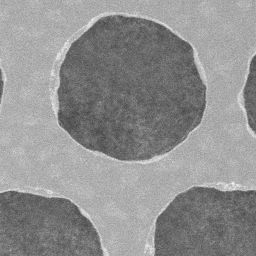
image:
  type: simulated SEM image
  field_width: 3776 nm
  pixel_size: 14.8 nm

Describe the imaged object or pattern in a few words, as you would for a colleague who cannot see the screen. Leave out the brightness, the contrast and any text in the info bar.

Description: holes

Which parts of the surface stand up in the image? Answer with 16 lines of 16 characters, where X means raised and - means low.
XXXXXXXXXXXXXXXX
XXXXXX----XXXXXX
XXXXX-------XXXX
XXXX--------XXXX
XXXX---------XXX
XXXX---------XX-
XXXX---------XX-
XXXX---------XX-
XXXX--------XXXX
XXXXXX-----XXXXX
XXXXXXXXXXXXXXXX
XXXXXXXXXXXXXXXX
----XXXXXXX-----
-----XXXXX------
------XXXX------
------XXXX------